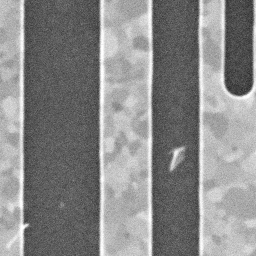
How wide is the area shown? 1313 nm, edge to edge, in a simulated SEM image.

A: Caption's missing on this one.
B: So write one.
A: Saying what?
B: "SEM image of groups of lines, slits or small figures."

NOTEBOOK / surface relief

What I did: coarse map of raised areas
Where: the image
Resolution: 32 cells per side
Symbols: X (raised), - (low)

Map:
XXX----------XXXXXX------XXX----
XXX----------XXXXXX------XXX----
XXX----------XXXXXX------XXX----
XXX----------XXXXXX------XXX----
XXX----------XXXXXX------XXX----
XXX----------XXXXXX------XXX----
XXX----------XXXXXX------XXX----
XXX----------XXXXXX------XXX----
XXX----------XXXXXX------XXX----
XXX----------XXXXXX------XXX----
XXX----------XXXXXX------XXX----
XXX----------XXXXXX------XXX---X
XXX----------XXXXXX------XXXXXXX
XXX----------XXXXXX------XXXXXXX
XXX----------XXXXXX------XXXXXXX
XXX----------XXXXXX------XXXXXXX
XXX----------XXXXXX------XXXXXXX
XXX----------XXXXXX------XXXXXXX
XXX----------XXXXXX------XXXXXXX
XXX----------XXXXXX------XXXXXXX
XXX----------XXXXXX------XXXXXXX
XXX----------XXXXXX------XXXXXXX
XXX----------XXXXXX------XXXXXXX
XXX----------XXXXXX------XXXXXXX
XXX----------XXXXXX------XXXXXXX
XXX----------XXXXXX------XXXXXXX
XXX----------XXXXXX------XXXXXXX
XXX----------XXXXXX------XXXXXXX
XXX----------XXXXXX------XXXXXXX
XXX----------XXXXXX------XXXXXXX
XXX----------XXXXXX------XXXXXXX
XXX----------XXXXXX------XXXXXXX